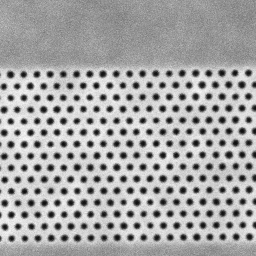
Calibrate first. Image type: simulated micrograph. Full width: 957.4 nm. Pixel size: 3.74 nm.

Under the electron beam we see a regular array of holes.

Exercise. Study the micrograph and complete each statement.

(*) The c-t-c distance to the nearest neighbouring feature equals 12.9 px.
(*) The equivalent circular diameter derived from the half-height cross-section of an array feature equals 0.027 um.